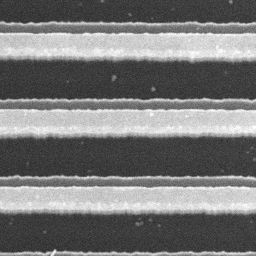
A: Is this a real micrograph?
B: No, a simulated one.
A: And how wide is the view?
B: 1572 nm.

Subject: lines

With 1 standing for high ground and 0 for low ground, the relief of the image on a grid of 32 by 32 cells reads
00000000000000000000000000000000
00000000000000000000000000000000
00000000000000000000000000000000
11111111111111111111111111111111
11111111111111111111111111111111
11111111111111111111111111111111
11111111111111111111111111111111
00000000000000000000000000000000
00000000000000000000000000000000
00000000000000000000000000000000
00000000000000000000000000000000
00000000000000000000000000000000
00001100000100111001100001001000
11111111111111111111111111111111
11111111111111111111111111111111
11111111111111111111111111111111
11111111111111111111111111111111
00000000000000000000000000000000
00000000000000000000000000000000
00000000000000000000000000000000
00000000000000000000000000000000
00000000000000000000000000000000
11111111111111111111111111111111
11111111111111111111111111111111
11111111111111111111111111111111
11111111111111111111111111111111
00000000000000000000000000000000
00000000000000000000000000000000
00000000000000000000000000000000
00000000000000000000000000000000
00000000000000000000000000000000
00000010100000000000000100000001